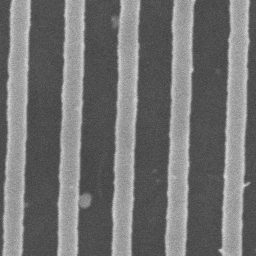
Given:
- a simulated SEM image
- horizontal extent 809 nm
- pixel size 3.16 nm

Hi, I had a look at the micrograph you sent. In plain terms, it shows lines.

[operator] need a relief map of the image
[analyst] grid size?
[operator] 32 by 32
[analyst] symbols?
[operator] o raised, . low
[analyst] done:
.ooo....ooo....oo.....oo.....oo.
.ooo....ooo....oo.....oo.....oo.
.ooo....ooo....oo.....oo.....oo.
.ooo....ooo....oo.....oo.....oo.
.oo.....oo.....oo.....oo.....oo.
.oo.....ooo....oo.....oo.....oo.
.oo.....oo.....oo.....oo.....oo.
.oo.....oo.....oo.....oo.....oo.
.oo.....oo.....oo.....oo.....oo.
.oo.....oo.....oo.....oo.....oo.
.oo.....oo.....oo....ooo....ooo.
.oo.....oo.....oo....ooo....ooo.
.oo.....oo.....oo....ooo....ooo.
.oo.....oo.....oo....ooo....ooo.
.oo.....oo.....oo....ooo....ooo.
.oo.....oo.....oo....ooo....ooo.
.oo.....oo....ooo....ooo....ooo.
.oo.....oo....ooo....ooo....ooo.
.oo.....oo.....oo....ooo....ooo.
.oo.....oo....ooo....oo.....ooo.
.oo....ooo....ooo....ooo....ooo.
.oo....ooo....ooo....oo.....ooo.
.oo....ooo....ooo....oo.....ooo.
.oo....ooo....ooo....oo.....ooo.
.oo....ooo....ooo....oo.....oo..
.oo....ooo....ooo....oo.....oo..
ooo....ooo....oo.....oo.....oo..
ooo....ooo....oo.....oo.....oo..
ooo....ooo....oo.....oo.....oo..
ooo....ooo....oo.....oo.....oo..
ooo....ooo....oo.....oo.....oo..
ooo....ooo....oo.....oo.....oo..